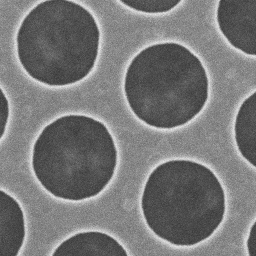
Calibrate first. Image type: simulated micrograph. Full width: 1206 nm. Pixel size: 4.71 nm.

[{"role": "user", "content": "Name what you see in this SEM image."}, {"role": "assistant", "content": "holes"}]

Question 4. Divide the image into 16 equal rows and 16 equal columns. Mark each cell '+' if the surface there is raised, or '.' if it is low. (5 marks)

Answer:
++...+++...+++..
+.....++++++++..
+.....++++++++..
+.....+++...++++
++....++.....+++
++++++++.....+++
++++++++.....++.
++++..+++...+++.
++.....++++++++.
++.....++++++++.
++.....+++...+++
+++....++.....++
.++++++++.....++
.++++++++.....++
..++++++++...+++
.+++....+++++++.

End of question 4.